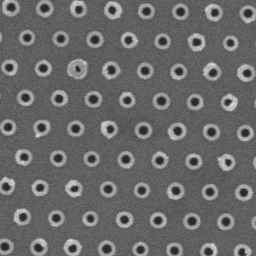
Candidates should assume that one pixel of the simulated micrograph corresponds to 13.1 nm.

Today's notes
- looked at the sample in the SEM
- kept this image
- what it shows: a regular array of ring-shaped raised bodies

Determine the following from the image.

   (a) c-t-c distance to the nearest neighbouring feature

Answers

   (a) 439 nanometres